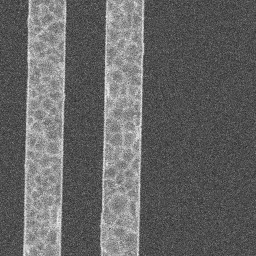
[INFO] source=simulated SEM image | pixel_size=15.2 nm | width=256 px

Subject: one or a few lines or trenches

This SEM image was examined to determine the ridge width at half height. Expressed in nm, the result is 552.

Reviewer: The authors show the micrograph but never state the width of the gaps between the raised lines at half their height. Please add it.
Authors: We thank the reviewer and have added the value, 0.632 µm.